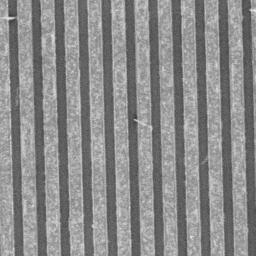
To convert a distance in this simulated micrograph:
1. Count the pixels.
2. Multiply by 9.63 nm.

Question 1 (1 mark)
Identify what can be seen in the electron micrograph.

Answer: parallel lines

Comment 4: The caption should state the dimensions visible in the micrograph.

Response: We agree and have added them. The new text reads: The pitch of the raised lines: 225 nm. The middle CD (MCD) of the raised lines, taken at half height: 126 nm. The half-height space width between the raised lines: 0.101 microns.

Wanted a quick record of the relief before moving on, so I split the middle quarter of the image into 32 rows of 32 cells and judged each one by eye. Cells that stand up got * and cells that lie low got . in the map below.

.**....***..***...***...***...**
.***...***..***...***...***...**
.***...***..***...***...***...**
.***...***..****..***...***...**
.***...***..****..***...***...**
.***...***...***..***...***...**
.***...***...***..***...***...**
.***...***...***..***...***...**
.***...***...***..****..***...**
.***...***...***...***..***...**
.***...***...***...***..***...**
.***...***...***...***..***...**
.***...***...***...***..***...**
.***...***...***...***..***...**
.***...***...***..****..***...**
.***...***...***...***..***...**
.***...***...***...***..***...**
.***...***...***...***..***...**
.***...***...***...***..***...**
.***...***...***...***..***...**
.***...***...***...***..***...**
.***...***...***...***..****..**
.***...***...***...***...***..**
.***...***...***...***...***..**
.***...***...***...***...***..**
.***...***...***...***...***..**
.***...***...***...***...***..**
.***...***...***...***...***...*
.***...***...***...***...***...*
.***...***...***...***...***...*
.***...***...***...***...***...*
.***...***...***...***...***...*